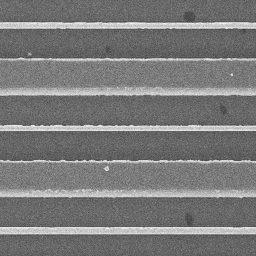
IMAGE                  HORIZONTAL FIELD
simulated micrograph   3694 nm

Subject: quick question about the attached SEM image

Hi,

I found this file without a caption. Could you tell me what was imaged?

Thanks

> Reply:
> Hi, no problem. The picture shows lines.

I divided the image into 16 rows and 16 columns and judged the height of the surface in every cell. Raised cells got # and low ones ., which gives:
................
................
................
................
################
################
................
................
................
................
################
################
................
................
................
................